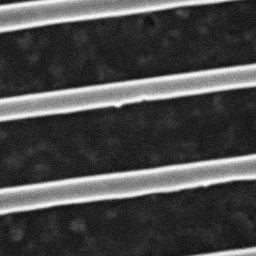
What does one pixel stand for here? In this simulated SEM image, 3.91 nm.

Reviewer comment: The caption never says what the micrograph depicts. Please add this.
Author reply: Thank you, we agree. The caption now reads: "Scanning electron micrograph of one or a few lines or trenches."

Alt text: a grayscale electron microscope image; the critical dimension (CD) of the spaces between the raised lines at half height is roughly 269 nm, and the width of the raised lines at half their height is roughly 83.6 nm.